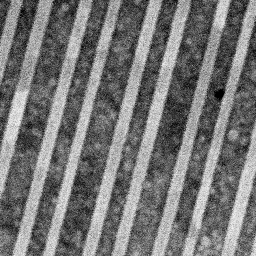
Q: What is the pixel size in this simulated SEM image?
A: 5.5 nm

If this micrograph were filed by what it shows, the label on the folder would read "parallel lines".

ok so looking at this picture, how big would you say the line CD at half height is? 0.0551 microns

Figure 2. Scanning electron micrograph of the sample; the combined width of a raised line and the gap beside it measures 183 nm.